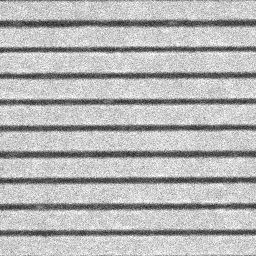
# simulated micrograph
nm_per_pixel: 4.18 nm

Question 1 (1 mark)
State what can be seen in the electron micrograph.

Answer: parallel lines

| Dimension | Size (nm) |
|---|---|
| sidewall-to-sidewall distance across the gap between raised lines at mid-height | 30.8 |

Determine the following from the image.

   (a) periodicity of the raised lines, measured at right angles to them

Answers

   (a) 109 nm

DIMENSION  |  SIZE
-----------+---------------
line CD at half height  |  79.4 nm